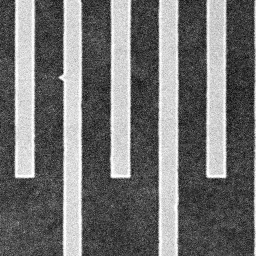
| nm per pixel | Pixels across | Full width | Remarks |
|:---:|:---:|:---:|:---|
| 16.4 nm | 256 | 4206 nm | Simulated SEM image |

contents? parallel lines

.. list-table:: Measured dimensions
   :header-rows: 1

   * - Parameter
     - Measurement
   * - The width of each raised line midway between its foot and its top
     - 276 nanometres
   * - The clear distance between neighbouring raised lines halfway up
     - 0.507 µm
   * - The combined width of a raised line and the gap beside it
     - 789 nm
